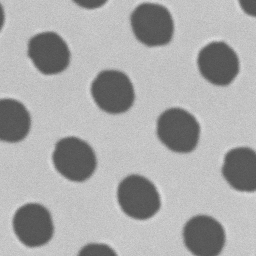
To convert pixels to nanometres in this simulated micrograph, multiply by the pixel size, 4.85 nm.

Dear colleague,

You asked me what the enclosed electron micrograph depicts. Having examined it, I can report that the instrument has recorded a regular array of holes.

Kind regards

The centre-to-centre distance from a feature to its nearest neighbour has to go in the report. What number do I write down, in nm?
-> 366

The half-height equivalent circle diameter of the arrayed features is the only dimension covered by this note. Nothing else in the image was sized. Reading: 214 nanometres